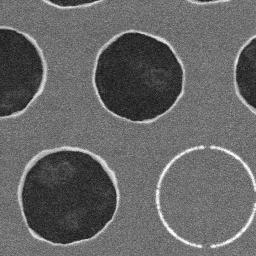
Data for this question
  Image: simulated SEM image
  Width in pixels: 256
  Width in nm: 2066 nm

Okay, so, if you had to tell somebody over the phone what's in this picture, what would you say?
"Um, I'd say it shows holes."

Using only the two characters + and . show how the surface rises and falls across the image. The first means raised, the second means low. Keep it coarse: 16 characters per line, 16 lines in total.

++++++++++++++++
++++++++++++++++
..+++++...++++++
...+++.....++++.
...+++.....++++.
..++++.....++++.
..+++++....++++.
++++++++.+++++++
++++++++++++++++
+++..+++++++++++
++.....+++++++++
+......+++++++++
+......+++++++++
++.....+++++++++
++....++++++++++
++++++++++++++++